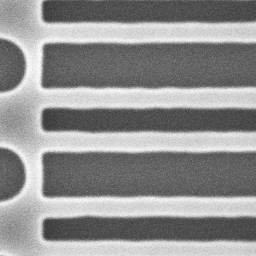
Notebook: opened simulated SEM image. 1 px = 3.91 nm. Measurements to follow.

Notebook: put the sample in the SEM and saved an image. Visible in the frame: groups of lines, slits or small figures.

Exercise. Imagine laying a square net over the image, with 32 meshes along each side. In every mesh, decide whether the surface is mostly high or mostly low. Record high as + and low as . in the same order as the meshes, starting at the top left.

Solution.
+++++...........................
+++++...........................
+++++...........................
++++++++++++++++++++++++++++++++
++++++++++++++++++++++++++++++++
..+++...........................
...++...........................
...++...........................
...++...........................
...++...........................
...++...........................
.+++++++++++++++++++++++++++++++
++++++++++++++++++++++++++++++++
++++++..........................
+++++...........................
+++++...........................
++++++..........................
++++++++++++++++++++++++++++++++
.+++++++++++++++++++++++++++++++
...++...........................
...++...........................
...++...........................
...++...........................
...++...........................
..+++...........................
++++++++++++++++++++++++++++++++
++++++++++++++++++++++++++++++++
+++++...........................
+++++...........................
+++++...........................
++++++++++++++++++++++++++++++++
++++++++++++++++++++++++++++++++